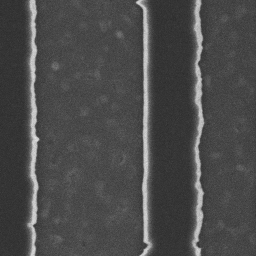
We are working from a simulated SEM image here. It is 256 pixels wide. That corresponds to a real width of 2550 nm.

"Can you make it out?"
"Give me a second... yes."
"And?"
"one or a few lines or trenches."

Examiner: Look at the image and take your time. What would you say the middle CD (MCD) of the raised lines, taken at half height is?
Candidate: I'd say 529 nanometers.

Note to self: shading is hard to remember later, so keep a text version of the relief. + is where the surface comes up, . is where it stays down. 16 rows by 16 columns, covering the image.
++.......+++....
++.......+++....
++.......+++....
++.......+++....
++.......+++....
++.......+++....
++.......+++....
++.......++++...
++.......+++....
++.......+++....
++.......+++....
++.......+++....
++.......+++....
++.......+++....
++.......+++....
++.......+++....